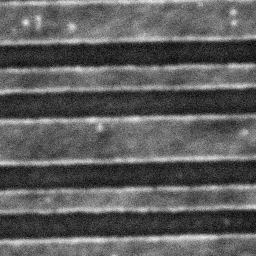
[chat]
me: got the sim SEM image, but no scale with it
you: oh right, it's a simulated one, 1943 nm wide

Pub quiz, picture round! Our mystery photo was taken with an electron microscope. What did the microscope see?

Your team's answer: lines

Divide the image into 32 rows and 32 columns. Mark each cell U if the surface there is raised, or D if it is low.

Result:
UUUUUUUUUUUUUUUUUUUUUUUUUUUUUUUU
UUUUUUUUUUUUUUUUUUUUUUUUUUUUUUUU
UUUUUUUUUUUUUUUUUUUUUUUUUUUUUUUU
UUUUUUUUUUUUUUUUUUUUUUUUUUUUUUUU
UUUUUUUUUUUUUUUUUUUUUUUUUUUUUUUU
DDDDDDDDDDDDDDDDDDDDDDDDDDDDDDDD
DDDDDDDDDDDDDDDDDDDDDDDDDDDDDDDD
DDDDDDDDDDDDDDDDDDDDDDDDDDDDDDDD
DDDDDDDDDUDUUUUUUUUUUUUUUUUUUUUU
UUUUUUUUUUUUUUUUUUUUUUUUUUUUUUUU
UUUUUUUUUUUUUUUUUUUUUUUUUUUUUUUU
UUDDDDDDDDDDDDDDDDDDDDDDDDDDDDDD
DDDDDDDDDDDDDDDDDDDDDDDDDDDDDDDD
DDDDDDDDDDDDDDDDDDDDDDDDDDDDDDDD
DDDDDDDDDDDDDDDDDDDDDDDDDDDDDDUU
UUUUUUUUUUUUUUUUUUUUUUUUUUUUUUUU
UUUUUUUUUUUUUUUUUUUUUUUUUUUUUUUU
UUUUUUUUUUUUUUUUUUUUUUUUUUUUUUUU
UUUUUUUUUUUUUUUUUUUUUUUUUUUUUUUU
UUUUUUUUUUUUUUUUUUUUUUUUUUUUUUUU
DDDDDDDDDDDDDDDDDDDDDDDDDDDDDDDD
DDDDDDDDDDDDDDDDDDDDDDDDDDDDDDDD
DDDDDDDDDDDDDDDDDDDDDDDDDDDDDDDD
DDDDDDDDDDDDDDDDDDDUUUUUUUUUUUUU
UUUUUUUUUUUUUUUUUUUUUUUUUUUUUUUU
UUUUUUUUUUUUUUUUUUUUUUUUUUUUUUUU
UUUDUUUDDDDDDDDDDDDDDDDDDDDDDDDD
DDDDDDDDDDDDDDDDDDDDDDDDDDDDDDDD
DDDDDDDDDDDDDDDDDDDDDDDDDDDDDDDD
DDDDDDDDDDDDDDDDDDDDDDDDDDDDUUUU
UUUUUUUUUUUUUUUUUUUUUUUUUUUUUUUU
UUUUUUUUUUUUUUUUUUUUUUUUUUUUUUUU